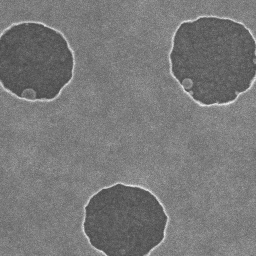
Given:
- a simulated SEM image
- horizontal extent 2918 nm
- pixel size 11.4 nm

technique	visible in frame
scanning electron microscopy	holes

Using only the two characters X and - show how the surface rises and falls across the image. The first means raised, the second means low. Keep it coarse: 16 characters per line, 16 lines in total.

XXXXXXXXXXXXXXXX
X-XXXXXXXXXX---X
----XXXXXXX-----
-----XXXXXX-----
-----XXXXXX-----
----XXXXXXX----X
XXXXXXXXXXXXXXXX
XXXXXXXXXXXXXXXX
XXXXXXXXXXXXXXXX
XXXXXXXXXXXXXXXX
XXXXXXXXXXXXXXXX
XXXXXXXXXXXXXXXX
XXXXXX----XXXXXX
XXXXX-----XXXXXX
XXXXX-----XXXXXX
XXXXXX----XXXXXX